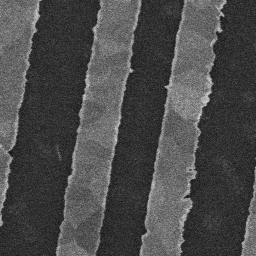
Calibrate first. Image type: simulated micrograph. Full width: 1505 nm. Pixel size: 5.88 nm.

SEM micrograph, one or a few lines or trenches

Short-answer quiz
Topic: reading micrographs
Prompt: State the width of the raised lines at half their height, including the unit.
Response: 227 nanometres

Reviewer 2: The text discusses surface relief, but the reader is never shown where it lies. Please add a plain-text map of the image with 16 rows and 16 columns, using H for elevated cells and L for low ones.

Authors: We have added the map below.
HHLLLLHHHLLHHHLL
HHLLLLHHLLLHHHLL
HHLLLLHHLLLHHLLL
HHLLLLHHLLLHHLLL
HHLLLHHHLLLHHLLL
HHLLLHHHLLLHHLLL
HLLLLHHHLLHHHLLL
HLLLLHHLLLHHLLLL
HLLLLHHLLLHHLLLL
HLLLLHHLLLHHLLLL
HLLLLHHLLLHHLLLL
LLLLHHHLLLHHLLLL
LLLLHHHLLHHHLLLL
LLLLHHLLLHHHLLLL
LLLLHHLLLHHLLLLH
LLLLHHLLLHHLLLLH